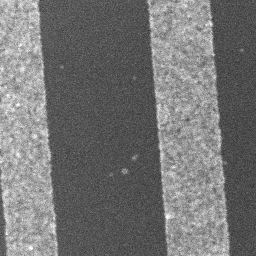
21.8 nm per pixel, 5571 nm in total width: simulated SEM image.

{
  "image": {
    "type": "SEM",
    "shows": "one or a few lines or trenches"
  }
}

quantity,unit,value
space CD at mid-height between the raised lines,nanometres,2410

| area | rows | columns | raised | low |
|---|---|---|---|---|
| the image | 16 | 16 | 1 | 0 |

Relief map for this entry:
1100000001111000
1100000001111000
1100000001111000
1110000000111000
1110000000111000
1110000000111000
1110000000111100
1110000000111100
1110000000111100
1110000000111100
1110000000111100
1110000000111100
1110000000111100
1110000000111100
1110000000111100
1111000000111100